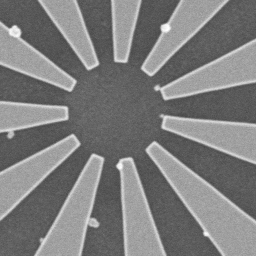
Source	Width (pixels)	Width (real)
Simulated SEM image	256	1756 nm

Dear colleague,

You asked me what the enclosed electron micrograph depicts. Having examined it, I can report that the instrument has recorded groups of lines, slits or small figures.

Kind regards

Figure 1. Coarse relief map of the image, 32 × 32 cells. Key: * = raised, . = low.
.....*****....****....******....
......****....***.....*****.....
.......***....***....*****......
**.....****...***...*****.......
***.....***...***...****........
***......**...**...****........*
*****....***..**...***.......***
******....**..**..***......*****
.******...........**.....*******
....*****..............*********
.......**............*********..
....................*****.......
................................
********........................
********........................
*****...............************
.....................***********
........**..............********
......****........**.......*****
....*****..*.......***.......***
..*****....**..**..****.........
******....***..**...****........
*****.....**...***...****.......
****.....***...***....*****.....
***......***...***....******....
**......****...***.....******...
*......****....****.....******..
.......****....****......*******
......*****....****......*******
......*****.....****......******
.....*****......****.......*****
.....*****......*****......*****